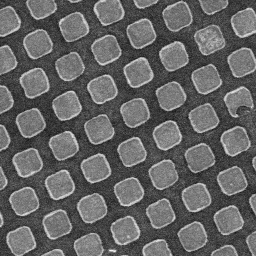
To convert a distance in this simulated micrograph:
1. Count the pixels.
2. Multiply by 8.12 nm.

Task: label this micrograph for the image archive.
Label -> a regular array of raised bodies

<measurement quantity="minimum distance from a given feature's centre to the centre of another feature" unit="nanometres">317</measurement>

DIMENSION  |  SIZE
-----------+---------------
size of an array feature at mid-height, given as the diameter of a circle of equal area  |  221 nm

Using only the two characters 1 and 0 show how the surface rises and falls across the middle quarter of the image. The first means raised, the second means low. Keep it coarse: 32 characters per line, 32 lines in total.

11111000000000001111100001111100
11111000000000011111110000110000
11110000000000011111110000000000
11100000111100001111110000000000
00000001111100001111100000000000
00000011111110000110000001111000
00000011111110000000000111111000
11100001111110000000000111111100
11100001111100000000000111111100
11110000110000001111000011111100
11110000000000011111100011111000
11110000000000111111100000100000
11100000000000111111100000000001
11000000111000011111100000000001
00000011111000011111000001100000
00000111111100001100000011110000
00000011111100000000000111111000
11000011111100000000001111111000
11000011111000000000000111111000
11100001100000011110000111111000
11100000000000111111000011100000
11100000000001111111000000000001
11000000000000111111100000000011
00000011110000111111000000000011
00000111111000011110000001100001
00000111111000000000000111100001
00000111111000000000011111110000
10000111111000000000011111110000
11000111110000000000001111110000
11000001000000111100001111110000
11000000000001111110000111000000
11000000000001111110000000000011